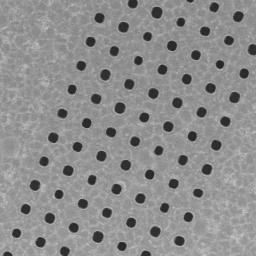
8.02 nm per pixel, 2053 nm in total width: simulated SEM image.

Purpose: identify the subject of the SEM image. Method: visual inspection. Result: a regular array of holes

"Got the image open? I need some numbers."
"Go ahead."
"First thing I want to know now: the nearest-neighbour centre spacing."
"204 nanometers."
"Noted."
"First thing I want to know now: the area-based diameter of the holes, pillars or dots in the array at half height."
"10.4 px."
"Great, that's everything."